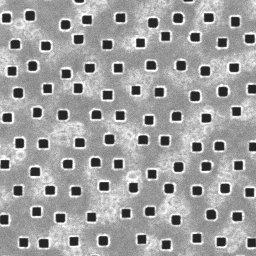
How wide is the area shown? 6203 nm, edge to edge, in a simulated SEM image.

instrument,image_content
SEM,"a regular array of holes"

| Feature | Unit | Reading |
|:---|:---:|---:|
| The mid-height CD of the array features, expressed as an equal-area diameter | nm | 259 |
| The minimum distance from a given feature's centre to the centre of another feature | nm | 585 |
